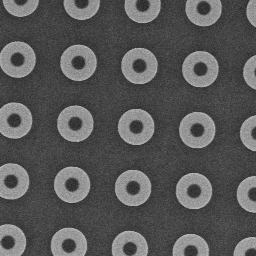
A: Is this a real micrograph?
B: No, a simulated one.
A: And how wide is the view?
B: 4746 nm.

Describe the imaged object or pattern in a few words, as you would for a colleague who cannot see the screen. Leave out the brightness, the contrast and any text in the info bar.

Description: an array of small figures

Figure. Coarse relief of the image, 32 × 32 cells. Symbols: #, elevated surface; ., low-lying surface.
#####...####....####...#####...#
.###....####....####...#####...#
.................##.....###....#
................................
................................
.##.............................
####....####....###.....##......
####....####...#####...####....#
####....####...#####...####...##
.##.....###.....###....####...##
........................##.....#
................................
................................
###.....##......................
####...####....####....###......
####...#####...####....####...##
###....####....####...#####...##
........##.....####....###....##
...............................#
................................
.#..............................
###....####.....##..............
####...####....####...####.....#
###....####...#####...####....##
###....####....####...####....##
................##.....###....##
...............................#
................................
##......#.......................
###....####....###.....##.......
###...#####...####....####....##
###...#####...####....####...###